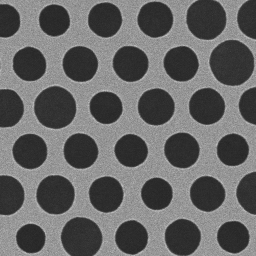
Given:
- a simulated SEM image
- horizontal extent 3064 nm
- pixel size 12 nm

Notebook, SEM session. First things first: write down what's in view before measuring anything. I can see a regular array of holes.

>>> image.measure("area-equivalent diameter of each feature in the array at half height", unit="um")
0.425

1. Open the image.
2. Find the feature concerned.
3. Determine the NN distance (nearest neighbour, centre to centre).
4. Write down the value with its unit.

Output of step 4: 0.601 microns